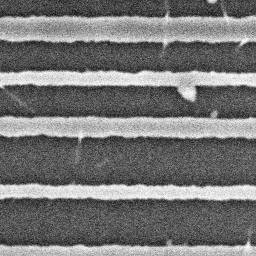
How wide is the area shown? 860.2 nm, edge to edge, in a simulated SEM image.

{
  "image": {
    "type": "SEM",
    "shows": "lines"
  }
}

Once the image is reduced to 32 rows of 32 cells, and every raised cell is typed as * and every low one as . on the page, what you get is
................................
................................
********************************
********************************
********************************
................................
................................
................................
................................
********************************
*...****************************
.......................*........
................................
................................
................................
********************************
********************************
................................
................................
................................
................................
................................
................................
********************************
********************************
................................
................................
................................
................................
................................
................................
********************************